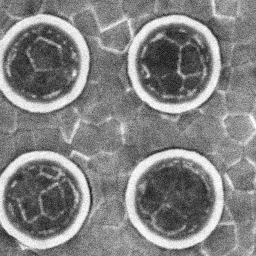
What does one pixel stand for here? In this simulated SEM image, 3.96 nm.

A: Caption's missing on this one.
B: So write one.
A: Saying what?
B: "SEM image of raised bodies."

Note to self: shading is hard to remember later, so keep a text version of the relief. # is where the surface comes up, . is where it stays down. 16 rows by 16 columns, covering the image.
................
.###......##....
#####....####...
#####...######..
#####...#####...
#####....####...
..##......##....
................
................
................
.###.....####...
#####...######..
#####...######..
#####...######..
.###.....####...
................